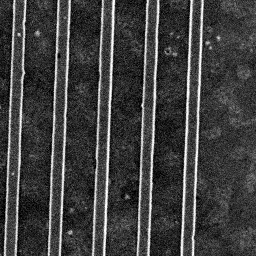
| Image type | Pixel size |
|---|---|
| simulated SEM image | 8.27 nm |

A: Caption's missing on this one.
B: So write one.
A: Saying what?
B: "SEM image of parallel lines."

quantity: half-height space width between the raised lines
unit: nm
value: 272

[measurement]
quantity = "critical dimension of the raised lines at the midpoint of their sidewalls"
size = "0.0981 micrometres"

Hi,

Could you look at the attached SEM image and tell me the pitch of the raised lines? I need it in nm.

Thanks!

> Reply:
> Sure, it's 366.